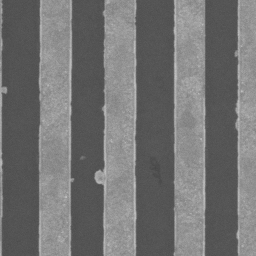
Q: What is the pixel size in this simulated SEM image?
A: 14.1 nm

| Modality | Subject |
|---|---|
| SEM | lines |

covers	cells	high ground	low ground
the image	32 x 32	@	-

-----@@@@----@@@@-----@@@@----@@
-----@@@@----@@@@-----@@@@----@@
-----@@@@----@@@@-----@@@@----@@
-----@@@@----@@@@-----@@@@----@@
-----@@@@----@@@@-----@@@@----@@
-----@@@@----@@@@-----@@@@----@@
-----@@@@----@@@@-----@@@@----@@
-----@@@@----@@@@-----@@@@----@@
-----@@@@----@@@@-----@@@@----@@
-----@@@@----@@@@-----@@@@----@@
-----@@@@----@@@@-----@@@@----@@
-----@@@@----@@@@-----@@@@----@@
-----@@@@----@@@@-----@@@@----@@
-----@@@@----@@@@-----@@@@----@@
-----@@@@----@@@@-----@@@@----@@
-----@@@@----@@@@-----@@@@----@@
-----@@@@----@@@@-----@@@@----@@
-----@@@@----@@@@-----@@@@----@@
-----@@@@----@@@@-----@@@@----@@
-----@@@@----@@@@-----@@@@----@@
-----@@@@----@@@@-----@@@@----@@
-----@@@@----@@@@-----@@@@----@@
-----@@@@---@@@@@-----@@@@----@@
-----@@@@----@@@@-----@@@-----@@
-----@@@@----@@@@-----@@@@----@@
-----@@@@----@@@@-----@@@@----@@
-----@@@@----@@@@-----@@@-----@@
-----@@@@----@@@@-----@@@-----@@
-----@@@@----@@@@-----@@@-----@@
-----@@@@----@@@@-----@@@-----@@
-----@@@@----@@@@-----@@@-----@@
-----@@@@----@@@@-----@@@-----@@